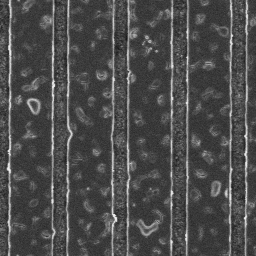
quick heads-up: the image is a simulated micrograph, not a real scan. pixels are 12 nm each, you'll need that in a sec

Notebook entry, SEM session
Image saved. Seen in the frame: parallel lines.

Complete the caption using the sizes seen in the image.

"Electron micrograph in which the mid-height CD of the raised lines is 540 nanometers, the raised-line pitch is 713 nm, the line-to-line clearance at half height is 0.176 µm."